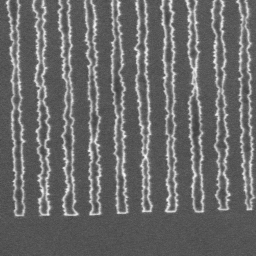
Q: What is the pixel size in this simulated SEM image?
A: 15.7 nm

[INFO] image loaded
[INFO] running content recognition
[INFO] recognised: parallel lines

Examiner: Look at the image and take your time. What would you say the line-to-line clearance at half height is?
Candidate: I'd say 271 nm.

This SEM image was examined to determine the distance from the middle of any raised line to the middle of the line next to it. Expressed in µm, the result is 0.401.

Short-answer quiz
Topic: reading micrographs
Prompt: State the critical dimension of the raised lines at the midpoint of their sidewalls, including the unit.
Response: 130 nanometres